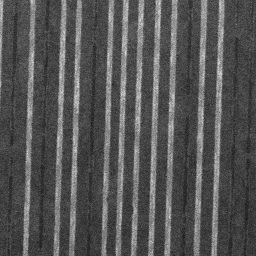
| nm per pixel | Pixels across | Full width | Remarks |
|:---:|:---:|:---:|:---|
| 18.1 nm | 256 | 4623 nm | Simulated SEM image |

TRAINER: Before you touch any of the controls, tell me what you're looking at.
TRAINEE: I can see parallel lines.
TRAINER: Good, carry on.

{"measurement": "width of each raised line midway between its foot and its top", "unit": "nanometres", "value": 76.7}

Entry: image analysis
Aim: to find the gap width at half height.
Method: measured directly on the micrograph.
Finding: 0.205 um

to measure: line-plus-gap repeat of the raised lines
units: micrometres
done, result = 0.285